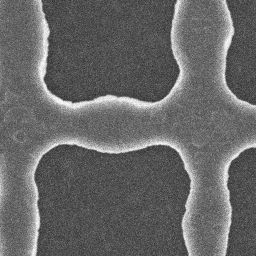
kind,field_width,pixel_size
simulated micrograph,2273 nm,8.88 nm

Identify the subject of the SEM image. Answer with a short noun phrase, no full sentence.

holes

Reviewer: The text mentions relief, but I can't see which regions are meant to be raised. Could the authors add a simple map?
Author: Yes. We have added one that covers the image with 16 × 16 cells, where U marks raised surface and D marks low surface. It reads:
UUUDDDDDDDDUUUDD
UUUDDDDDDDDUUUDD
UUUDDDDDDDDUUUDD
UUUDDDDDDDDUUUDD
UUUDDDDDDDDUUUDD
UUUDDDDDDDDUUUDD
UUUUUUUUUUUUUUUU
UUUUUUUUUUUUUUUU
UUUUUUUUUUUUUUUU
UUUDDDUUDDDUUUUD
UUDDDDDDDDDDUUDD
UUDDDDDDDDDDUUDD
UUDDDDDDDDDDUUDD
UUDDDDDDDDDUUUDD
UUDDDDDDDDDUUUDD
UUDDDDDDDDDDUUDD